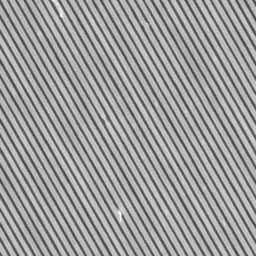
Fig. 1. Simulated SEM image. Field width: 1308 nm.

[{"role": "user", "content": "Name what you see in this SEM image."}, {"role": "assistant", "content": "parallel lines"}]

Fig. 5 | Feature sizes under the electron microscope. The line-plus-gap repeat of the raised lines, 37.6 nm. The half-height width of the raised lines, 0.02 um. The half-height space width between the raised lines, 14.5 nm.